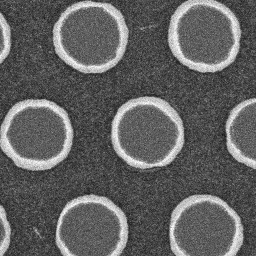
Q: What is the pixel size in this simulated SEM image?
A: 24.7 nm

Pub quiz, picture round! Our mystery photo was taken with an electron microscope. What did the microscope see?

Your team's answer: raised bodies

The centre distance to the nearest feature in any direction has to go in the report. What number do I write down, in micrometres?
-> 2.72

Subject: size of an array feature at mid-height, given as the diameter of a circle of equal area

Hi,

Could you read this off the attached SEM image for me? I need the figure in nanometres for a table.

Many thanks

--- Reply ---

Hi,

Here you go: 1660